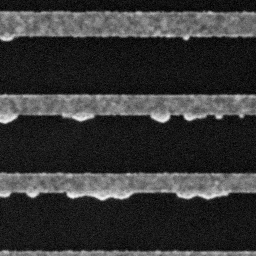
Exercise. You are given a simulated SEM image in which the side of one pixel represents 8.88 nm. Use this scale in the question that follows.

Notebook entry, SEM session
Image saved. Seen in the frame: lines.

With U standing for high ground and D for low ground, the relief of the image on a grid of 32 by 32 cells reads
DDDDDDDDDDDDDDDDDDDDDDDDDDDDDDDD
DDDDDDDDDDDDDDDDDDDDDDDDDDDDDDDD
UUUUUUUUUUUUUUUUUUUUUUUUUUUUUUUU
UUUUUUUUUUUUUUUUUUUUUUUUUUUUUUUU
UUDDDDDDDDUDDDDDDUUDUUUDUUUDDDDD
DDDDDDDDDDDDDDDDDDDDDDDDDDDDDDDD
DDDDDDDDDDDDDDDDDDDDDDDDDDDDDDDD
DDDDDDDDDDDDDDDDDDDDDDDDDDDDDDDD
DDDDDDDDDDDDDDDDDDDDDDDDDDDDDDDD
DDDDDDDDDDDDDDDDDDDDDDDDDDDDDDDD
DDDDDDDDDDDDDDDDDDDDDDDDDDDDDDDD
DDDDDDDDDDDDDDDDDDDDDDDDDDDDDDDD
UUUUUUUUUUUUUUUUUUUUUUUUUUUUUUUU
UUUUUUUUUUUUUUUUUUUUUUUUUUUUUUUU
UUDDDDDDDUUDDDDDDDDUUDDUDDDDDDDD
DDDDDDDDDDDDDDDDDDDDDDDDDDDDDDDD
DDDDDDDDDDDDDDDDDDDDDDDDDDDDDDDD
DDDDDDDDDDDDDDDDDDDDDDDDDDDDDDDD
DDDDDDDDDDDDDDDDDDDDDDDDDDDDDDDD
DDDDDDDDDDDDDDDDDDDDDDDDDDDDDDDD
DDDDDDDDDDDDDDDDDDDDDDDDDDDDDDDD
DDDDDDDDDDDDDDDDDDDDDDDDDDDDDDDD
UUUUUUUUUUUUUUUUUUUUUUUUUUUUUUUU
UUUUUUUUUUUUUUUUUUUUUUUUUUUUUUUU
DDDDDDDDDDDDUUUUDDDDDDDUDDUDDDDD
DDDDDDDDDDDDDDDDDDDDDDDDDDDDDDDD
DDDDDDDDDDDDDDDDDDDDDDDDDDDDDDDD
DDDDDDDDDDDDDDDDDDDDDDDDDDDDDDDD
DDDDDDDDDDDDDDDDDDDDDDDDDDDDDDDD
DDDDDDDDDDDDDDDDDDDDDDDDDDDDDDDD
DDDDDDDDDDDDDDDDDDDDDDDDDDDDDDDD
DDDDDDDDUDUUUDUUDDDDDDDDDDDDDDDD